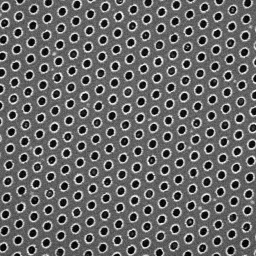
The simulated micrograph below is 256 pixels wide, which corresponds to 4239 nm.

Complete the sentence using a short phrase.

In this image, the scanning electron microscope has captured a regular array of holes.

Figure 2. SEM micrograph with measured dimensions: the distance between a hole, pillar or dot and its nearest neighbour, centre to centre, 0.267 µm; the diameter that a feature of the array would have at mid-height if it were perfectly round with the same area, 141 nm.